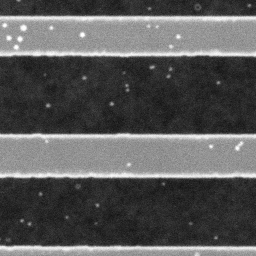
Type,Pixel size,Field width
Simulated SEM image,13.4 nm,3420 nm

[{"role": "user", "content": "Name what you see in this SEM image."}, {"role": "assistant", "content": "lines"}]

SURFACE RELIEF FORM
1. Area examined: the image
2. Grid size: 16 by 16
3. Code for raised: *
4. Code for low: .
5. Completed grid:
................
****************
****************
................
................
................
................
................
****.****......*
****************
****************
................
................
................
................
***************.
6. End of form